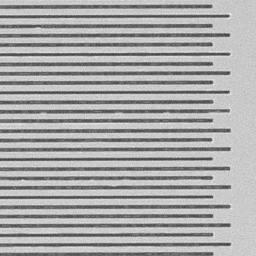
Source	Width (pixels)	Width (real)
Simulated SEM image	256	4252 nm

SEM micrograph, parallel lines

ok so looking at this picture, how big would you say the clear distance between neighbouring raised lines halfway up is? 70.6 nm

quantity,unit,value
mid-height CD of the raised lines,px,5.5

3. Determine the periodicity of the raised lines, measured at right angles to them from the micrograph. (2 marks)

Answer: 158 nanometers